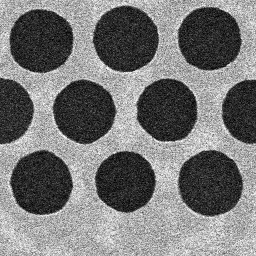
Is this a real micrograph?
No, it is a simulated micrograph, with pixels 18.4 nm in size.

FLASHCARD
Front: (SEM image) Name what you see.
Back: a regular array of holes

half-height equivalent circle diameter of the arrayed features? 1.17 µm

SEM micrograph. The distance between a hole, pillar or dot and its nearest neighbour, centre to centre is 1510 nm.